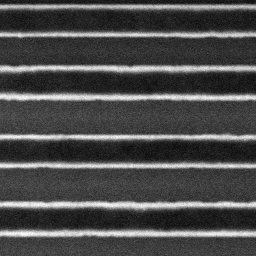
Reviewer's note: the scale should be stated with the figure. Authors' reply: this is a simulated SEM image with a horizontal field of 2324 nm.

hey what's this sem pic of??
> lines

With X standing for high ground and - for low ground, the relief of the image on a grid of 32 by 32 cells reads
--------------------------------
XXXXXXXXXXXXXXXXXXXXXXXXXXXXXXXX
XXXXXXXXXXXXXXXXXXXXXXXXXXXXXXXX
XXXXXXXXXXXXXXXXXXXXXXXXXXXXXXXX
XXXXXXXXXXXXXXXXXXXXXXXXXXXXXXXX
--------------------------------
--------------------------------
--------------------------------
XXXXXXXXXXXXXXXXXXXXXXXXXXXXXXXX
XXXXXXXXXXXXXXXXXXXXXXXXXXXXXXXX
XXXXXXXXXXXXXXXXXXXXXXXXXXXXXXXX
XXXXXXXXXXXXXXXXXXXXXXXXXXXXXXXX
--------------------------------
--------------------------------
--------------------------------
--------------------------------
--------------------------------
XXXXXXXXXXXXXXXXXXXXXXXXXXXXXXXX
XXXXXXXXXXXXXXXXXXXXXXXXXXXXXXXX
XXXXXXXXXXXXXXXXXXXXXXXXXXXXXXXX
XXXXXXXXXXXXXXXXXXXXXXXXXXXXXXXX
--------------------------------
--------------------------------
--------------------------------
--------------------------------
XXXXXXXXXXXXXXXXX--XX-XXXXXXXXXX
XXXXXXXXXXXXXXXXXXXXXXXXXXXXXXXX
XXXXXXXXXXXXXXXXXXXXXXXXXXXXXXXX
XXXXXXXXXXXXXXXXXXXXXXXXXXXXXXXX
--------------------------------
--------------------------------
--------------------------------